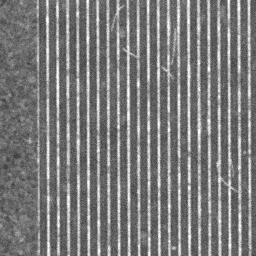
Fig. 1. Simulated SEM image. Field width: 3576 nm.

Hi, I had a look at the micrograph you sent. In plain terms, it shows parallel lines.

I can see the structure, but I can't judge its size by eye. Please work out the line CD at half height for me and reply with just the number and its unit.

26.2 nm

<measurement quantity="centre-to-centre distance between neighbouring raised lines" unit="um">0.141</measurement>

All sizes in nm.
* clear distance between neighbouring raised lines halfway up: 114